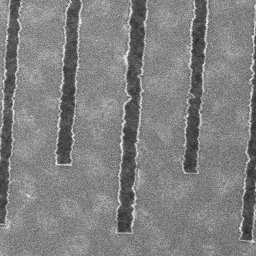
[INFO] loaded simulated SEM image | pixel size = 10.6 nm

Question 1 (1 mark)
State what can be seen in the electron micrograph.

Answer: one or a few lines or trenches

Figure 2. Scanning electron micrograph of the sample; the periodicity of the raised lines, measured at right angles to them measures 663 nm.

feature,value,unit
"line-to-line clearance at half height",502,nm